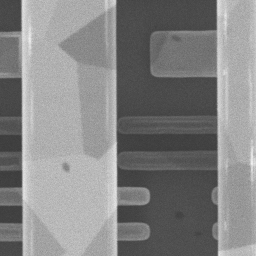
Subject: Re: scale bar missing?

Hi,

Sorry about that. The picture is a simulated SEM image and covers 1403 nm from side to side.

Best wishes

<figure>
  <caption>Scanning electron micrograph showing wiring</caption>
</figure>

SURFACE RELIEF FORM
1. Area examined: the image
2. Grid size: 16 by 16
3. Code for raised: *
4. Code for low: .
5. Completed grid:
.******.......**
.******.......**
.******.......**
.******.......**
.******.......**
.******.......**
.******.......**
.******.......**
.******.......**
.******.......**
.******.......**
.******.......**
.******.......**
.******.......**
.******.......**
.******.......**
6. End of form